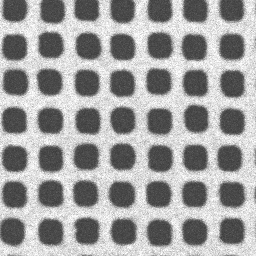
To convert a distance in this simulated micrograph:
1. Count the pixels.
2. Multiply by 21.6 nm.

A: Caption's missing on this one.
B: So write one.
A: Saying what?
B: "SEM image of a regular array of holes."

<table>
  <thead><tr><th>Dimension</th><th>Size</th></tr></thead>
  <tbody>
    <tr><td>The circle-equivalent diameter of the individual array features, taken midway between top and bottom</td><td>0.589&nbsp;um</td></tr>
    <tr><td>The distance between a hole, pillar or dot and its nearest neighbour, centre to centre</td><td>765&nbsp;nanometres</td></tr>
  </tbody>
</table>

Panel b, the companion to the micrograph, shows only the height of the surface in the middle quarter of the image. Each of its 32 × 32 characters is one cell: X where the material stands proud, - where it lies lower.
XXXXXXXXXXXXXXXXXXXXXXXXXXXXXXXX
XXXX---XXXXXXX-XXXXXX-----XXXXXX
XXX-----XXXX-----XXXX------XXX--
XXX------XX------XXX-------XXX--
XXX------XX-------XX-------XXX--
XXX------XX-------XX-------XXX--
XXX------XXX------XXX------XXX--
XXXX----XXXX-----XXXXX---XXXXXX-
XXXXXXXXXXXXXXXXXXXXXXXXXXXXXXXX
XXXXXXXXXXXXXXXXXXXXXXXXXXXXXXXX
XXXXXXXXXXXXXXXXXXXXXXXXXXXXXXX-
XXXX----XXXX-----XXXXX----XXXX--
XXX------XXX------XXX------XXX--
XXX------XXX------XXX------XXX--
XXX------XXX------XXX------XXX--
XXX------XXX------XXX------XXX--
XXX------XXX-----XXXX------XXXX-
XXXXX---XXXXXX--XXXXXX----XXXXXX
XXXXXXXXXXXXXXXXXXXXXXXXXXXXXXXX
XXXXXXXXXXXXXXXXXXXXXXXXXXXXXXXX
XXX-----XXXX-----XXXXX----XXXXX-
XXX------XXX------XXX------XXX--
XX-------XX-------XXX------XXX--
XX-------XX-------XXX------XXX--
XX-------XXX------XXX------XXX--
XXX------XXX-----XXXX------XXX--
XXXX---XXXXXXX-XXXXXXX----XXXXX-
XXXXXXXXXXXXXXXXXXXXXXXXXXXXXXXX
XXXXXXXXXXXXXXXXXXXXXXXXXXXXXXXX
XXX----XXXXX----XXXXXX---XXXXXX-
XX------XXXX-----XXXX-----XXXX--
XX-------XX-------XX-------XXX--